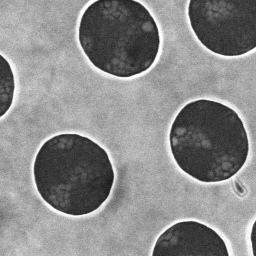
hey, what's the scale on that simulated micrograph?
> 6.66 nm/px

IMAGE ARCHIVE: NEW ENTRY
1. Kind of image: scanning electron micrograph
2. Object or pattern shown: holes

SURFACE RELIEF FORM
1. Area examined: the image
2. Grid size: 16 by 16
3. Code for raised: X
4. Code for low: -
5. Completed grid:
XXXXX----XXX----
XXXXX-----XX----
XXXXX-----XX----
XXXXX-----XXXXXX
-XXXXXX--XXXXXXX
-XXXXXXXXXXXXXXX
-XXXXXXXXXXX--XX
XXXXXXXXXXX----X
XXX--XXXXXX----X
XX-----XXXX-----
XX-----XXXX----X
XX-----XXXXXXXXX
XXX----XXXXXXXXX
XXXXXXXXXXXXXXXX
XXXXXXXXXX---XXX
XXXXXXXXXX----XX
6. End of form